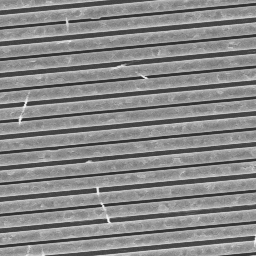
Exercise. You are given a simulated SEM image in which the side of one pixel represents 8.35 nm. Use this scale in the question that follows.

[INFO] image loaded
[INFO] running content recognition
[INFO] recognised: parallel lines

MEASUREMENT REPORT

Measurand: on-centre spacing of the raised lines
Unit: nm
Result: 129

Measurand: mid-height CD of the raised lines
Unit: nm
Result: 97.7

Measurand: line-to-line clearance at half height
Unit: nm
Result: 32.2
